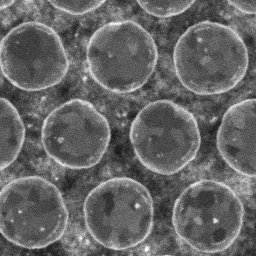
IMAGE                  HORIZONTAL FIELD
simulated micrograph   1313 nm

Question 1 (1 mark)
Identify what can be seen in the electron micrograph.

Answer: raised bodies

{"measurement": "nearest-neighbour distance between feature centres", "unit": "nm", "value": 456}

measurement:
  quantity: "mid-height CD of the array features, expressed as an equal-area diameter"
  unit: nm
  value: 351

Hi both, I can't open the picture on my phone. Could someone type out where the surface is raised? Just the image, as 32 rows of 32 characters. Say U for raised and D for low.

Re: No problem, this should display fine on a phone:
UDDDDDDUUUUUDDDDDUUUUUUUDDDDDUUU
DDDDDDDDDUUDDDDDDDDUUUUDDDDDDDDU
DDDDDDDDDDDDDDDDDDDDDDDDDDDDDDDD
DDUUUUDDDDDDDUUUUUDDDDDDUUUUDDDD
DUUUUUUDDDDDUUUUUUUDDDDUUUUUUUDD
UUUUUUUUDDDUUUUUUUUDDDUUUUUUUUDD
UUUUUUUUDDDUUUUUUUUUDDUUUUUUUUUD
UUUUUUUUDDDUUUUUUUUUDDUUUUUUUUUD
UUUUUUUUDDDUUUUUUUUDDDUUUUUUUUUD
DUUUUUUUDDDDUUUUUUUDDDUUUUUUUUDD
DDUUUUUDDDDDDUUUUUDDDDDUUUUUUDDD
DDDDDDDDDDDDDDDDDDDDDDDDDUUDDDDD
DDDDDDDDDDDDDDDDDDDDDDDDDDDDDDDD
UUDDDDDDUUUUDDDDDDUUUUDDDDDDDUUU
UUDDDDUUUUUUUDDDDUUUUUUUDDDDUUUU
UUUDDDUUUUUUUDDDDUUUUUUUUDDDUUUU
UUUDDUUUUUUUUUDDUUUUUUUUUDDUUUUU
UUUDDUUUUUUUUUDDUUUUUUUUUDDUUUUU
UUDDDDUUUUUUUDDDDUUUUUUUUDDDUUUU
UUDDDDUUUUUUUDDDDUUUUUUUDDDDUUUU
UDDDDDDDUUUUDDDDDDUUUUUDDDDDDUUU
DDDDDDDDDDDDDDDDDDDDDUDDDDDDDDUU
DDDUUDDDDDDDDDUUDDDDDDDDDDDDDDDD
DUUUUUUDDDDDUUUUUUDDDDDDUUUUDDDD
UUUUUUUDDDDUUUUUUUUDDDDUUUUUUDDD
UUUUUUUUDDDUUUUUUUUDDDUUUUUUUUDD
UUUUUUUUDDDUUUUUUUUDDDUUUUUUUUDD
UUUUUUUUDDDUUUUUUUUDDDUUUUUUUUDD
UUUUUUUUDDDUUUUUUUUDDDUUUUUUUUDD
DUUUUUUDDDDDUUUUUUDDDDDUUUUUUDDD
DDUUUUDDDDDDDUUUUDDDDDDDUUUUUDDD
DDDDDDDDDDDDDDDDDDDDDDDDDDDDDDDD